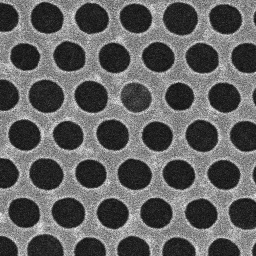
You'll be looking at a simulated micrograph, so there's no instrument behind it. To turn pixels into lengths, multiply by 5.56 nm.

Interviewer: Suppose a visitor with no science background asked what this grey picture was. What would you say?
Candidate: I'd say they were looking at a regular array of holes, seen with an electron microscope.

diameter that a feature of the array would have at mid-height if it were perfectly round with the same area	0.175	um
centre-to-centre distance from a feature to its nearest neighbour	245	nanometres